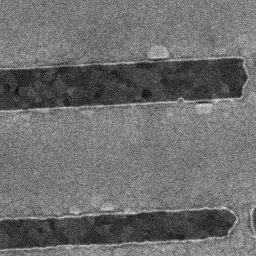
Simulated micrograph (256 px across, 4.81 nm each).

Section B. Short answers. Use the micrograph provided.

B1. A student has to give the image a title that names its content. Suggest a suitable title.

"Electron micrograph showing one or a few lines or trenches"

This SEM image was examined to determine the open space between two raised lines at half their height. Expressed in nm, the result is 519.